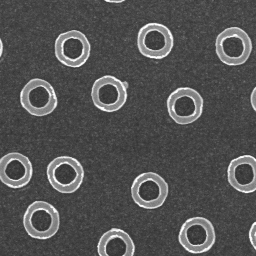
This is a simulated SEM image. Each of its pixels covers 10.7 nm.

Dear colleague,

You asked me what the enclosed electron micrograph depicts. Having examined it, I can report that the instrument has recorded a regular array of ring-shaped raised bodies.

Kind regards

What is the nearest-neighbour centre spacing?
670 nm